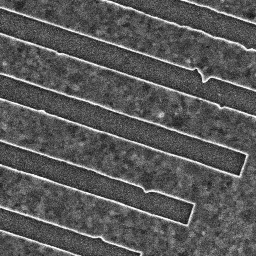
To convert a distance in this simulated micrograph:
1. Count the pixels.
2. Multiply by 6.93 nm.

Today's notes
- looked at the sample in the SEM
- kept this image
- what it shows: one or a few lines or trenches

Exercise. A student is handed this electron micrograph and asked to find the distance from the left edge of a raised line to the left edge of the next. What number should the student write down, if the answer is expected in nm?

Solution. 437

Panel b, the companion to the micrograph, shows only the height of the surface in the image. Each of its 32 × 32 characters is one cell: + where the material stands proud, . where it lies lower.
+++++++++++++++.........++++++++
..++++++++++++++++.........+++++
.....+++++++++++++++..........++
........++++++++++++++++........
+..........+++++++++++++++......
++++..........++++++++++++++++..
+++++++..........+++++++++++++++
++++++++++..........++++++++++++
+++++++++++++..........+++++++++
.+++++++++++++++.........+++++++
....+++++++++++++++..........+++
.......+++++++++++++++..........
+.........++++++++++++++++......
++++.........+++++++++++++++....
+++++++.........++++++++++++++++
++++++++++.........+++++++++++++
+++++++++++++.........++++++++++
++++++++++++++++.........+++++++
...++++++++++++++++..........+++
......++++++++++++++++.........+
.........++++++++++++++++......+
+++.........++++++++++++++++..++
++++++.........+++++++++++++++++
+++++++++.........++++++++++++++
++++++++++++.........+++++++++++
+++++++++++++++.........++++++++
..++++++++++++++++......++++++++
.....++++++++++++++++...++++++++
........++++++++++++++++++++++++
++.........+++++++++++++++++++++
+++++.........++++++++++++++++++
+++++++++........+++++++++++++++